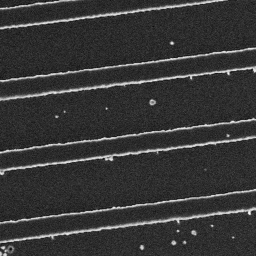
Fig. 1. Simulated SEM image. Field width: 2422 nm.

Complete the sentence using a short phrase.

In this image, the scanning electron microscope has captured lines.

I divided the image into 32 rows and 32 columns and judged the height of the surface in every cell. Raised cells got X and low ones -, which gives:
----XXXXXXXXXXXXXXXXXXXXX-------
XXXXXXXXXXXXXXXXX---------------
XXXXXXXXX-----------------------
X-------------------------------
--------------------------------
--------------------------------
---------------------------XXXXX
--------------------XXXXXXXXXXXX
-------------XXXXXXXXXXXXXXXXXXX
----XXXXXXXXXXXXXXXXXXXX--------
XXXXXXXXXXXXXXXX----------------
XXXXXXXX------------------------
--------------------------------
--------------------------------
--------------------------------
---------------------------XXXXX
-------------------XXXXXXXXXXXXX
------------XXXXXXXXXXXXXXXXXX--
---XXXXXXXXXXXXXXXXXXX----------
XXXXXXXXXXXXXXX-----------------
XXXXXX--------------------------
--------------------------------
--------------------------------
--------------------------------
--------------------------XXXXXX
-------------------XXXXXXXXXXXXX
----------XXXXXXXXXXXXXXXXXXX---
---XXXXXXXXXXXXXXXXXXX----------
XXXXXXXXXXXXXX------------------
XXXXXX--------------------------
--------------------------------
--------------------------------